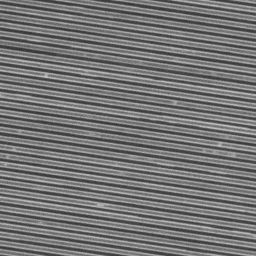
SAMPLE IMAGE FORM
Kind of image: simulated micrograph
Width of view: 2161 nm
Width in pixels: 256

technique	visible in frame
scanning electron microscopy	parallel lines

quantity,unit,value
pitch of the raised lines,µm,0.0729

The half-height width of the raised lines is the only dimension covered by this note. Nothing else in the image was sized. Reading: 35.5 nm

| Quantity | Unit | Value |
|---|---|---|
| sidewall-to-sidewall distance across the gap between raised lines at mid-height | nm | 35.5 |